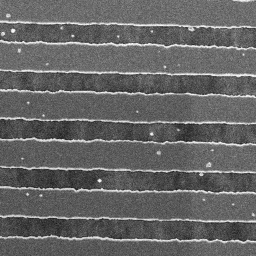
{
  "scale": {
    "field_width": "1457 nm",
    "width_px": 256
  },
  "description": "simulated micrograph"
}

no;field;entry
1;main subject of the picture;lines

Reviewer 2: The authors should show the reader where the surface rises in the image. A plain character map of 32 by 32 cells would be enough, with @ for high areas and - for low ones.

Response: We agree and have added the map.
@@@@@@@@@@@@@@@@@@@@@@@@@@@@@@@@
@@@@@@@@@@@@@@@@@@@@@@@@@@@@@@@@
@@@@@@@@@@@@@@@@@@@@@@@@@@@@@@@@
--------------------------------
--------------------------------
@@@@@@@@@@@--@------------------
@@@@@@@@@@@@@@@@@@@@@@@@@@@@@@@@
@@@@@@@@@@@@@@@@@@@@@@@@@@@@@@@@
@@@@@@@@@@@@@@@@@@@@@@@@@@@@@@@@
--------------------------------
--------------------------------
@@@@@@-@@@@@--------------------
@@@@@@@@@@@@@@@@@@@@@@@@@@@@@@@@
@@@@@@@@@@@@@@@@@@@@@@@@@@@@@@@@
@@@@@@@@@@@@@@@@@@@@@@@@@@@@@@@@
--------------------------------
--------------------------------
@@@@@-@@----@-------------------
@@@@@@@@@@@@@@@@@@@@@@@@@@@@@@@@
@@@@@@@@@@@@@@@@@@@@@@@@@@@@@@@@
@@@@@@@@@@@@@@@@@@@@@@@@@@@@@@@@
-----------------------------@@@
--------------------------------
@@@@@---------------------------
@@@@@@@@@@@@@@@@@@@@@@@@@@@@@@@@
@@@@@@@@@@@@@@@@@@@@@@@@@@@@@@@@
@@@@@@@@@@@@@@@@@@@@@@@@@@@@@@@@
--------------------@--@@@@@@@@@
--------------------------------
--------------------------------
@@@@@@@@@@@@@@@@@@@@@@@@@@@@@@@@
@@@@@@@@@@@@@@@@@@@@@@@@@@@@@@@@